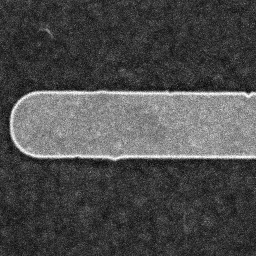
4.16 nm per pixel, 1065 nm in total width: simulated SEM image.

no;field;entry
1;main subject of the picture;one or a few lines or trenches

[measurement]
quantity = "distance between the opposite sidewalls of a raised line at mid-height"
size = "269 nanometers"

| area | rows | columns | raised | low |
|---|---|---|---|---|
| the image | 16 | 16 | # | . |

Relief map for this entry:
................
................
................
................
................
................
.###############
.###############
.###############
..##############
................
................
................
................
................
................